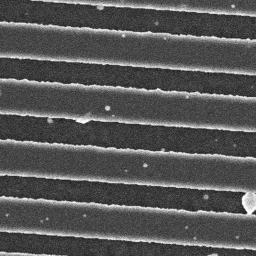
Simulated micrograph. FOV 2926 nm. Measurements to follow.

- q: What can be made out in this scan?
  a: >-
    lines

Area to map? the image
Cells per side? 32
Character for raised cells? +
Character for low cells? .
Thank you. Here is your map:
...........+++++++++++++++++++++
........................++++++++
................................
+++++++++.......................
++++++++++++++++++++++++........
++++++++++++++++++++++++++++++++
++++++++++++++++++++++++++++++++
......++++++++++++++++++++++++++
.....................+++++++++++
................................
++++++++++......................
++++++++++++++++++++++..........
++++++++++++++++++++++++++++++++
++++++++++++++++++++++++++++++++
....++++++++++++++++++++++++++++
..................++++++++++++++
................................
++..............................
+++++++++++++...................
++++++++++++++++++++++++++++....
++++++++++++++++++++++++++++++++
++++++++++++++++++++++++++++++++
...........+++++++++++++++++++++
.......................+++++++++
..............................++
+++++++++++++.................++
++++++++++++++++++++++++++.....+
++++++++++++++++++++++++++++++++
++++++++++++++++++++++++++++++++
.........+++++++++++++++++++++++
.......................+++++++++
................................